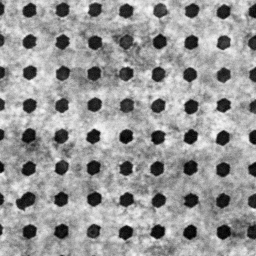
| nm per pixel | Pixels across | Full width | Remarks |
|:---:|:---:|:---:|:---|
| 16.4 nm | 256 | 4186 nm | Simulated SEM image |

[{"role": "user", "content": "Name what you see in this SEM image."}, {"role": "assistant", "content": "a regular array of holes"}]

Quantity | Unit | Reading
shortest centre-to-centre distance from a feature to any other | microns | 0.511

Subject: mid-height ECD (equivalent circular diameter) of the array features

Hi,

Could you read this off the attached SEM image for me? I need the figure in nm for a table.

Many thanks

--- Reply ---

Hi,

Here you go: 249